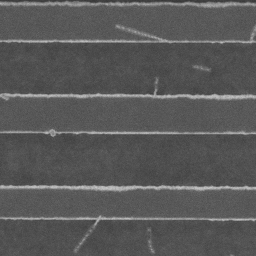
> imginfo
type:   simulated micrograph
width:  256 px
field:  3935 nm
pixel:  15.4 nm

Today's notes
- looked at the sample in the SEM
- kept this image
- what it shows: lines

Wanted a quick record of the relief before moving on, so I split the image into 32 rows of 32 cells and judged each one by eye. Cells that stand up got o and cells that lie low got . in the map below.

ooooooooooooooooooooooooo.o.oooo
oooooooooooooooooooooooooooooooo
oooooooooooooooooooooooooooooooo
oooooooooooooooooooooooooooooooo
oooooooooooooooooooooooooooooooo
................................
................................
................................
................................
................................
................................
................................
oooooooooooooooooooooooooooooooo
oooooooooooooooooooooooooooooooo
oooooooooooooooooooooooooooooooo
oooooooooooooooooooooooooooooooo
oooooooooooooooooooooooooooooooo
................................
................................
................................
................................
................................
................................
oooooooooooooooooooooooooooooooo
oooooooooooooooooooooooooooooooo
oooooooooooooooooooooooooooooooo
oooooooooooooooooooooooooooooooo
................................
................................
................................
................................
................................